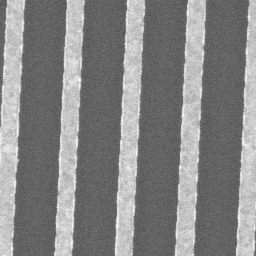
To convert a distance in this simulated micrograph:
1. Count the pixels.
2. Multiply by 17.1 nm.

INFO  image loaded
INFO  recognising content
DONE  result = lines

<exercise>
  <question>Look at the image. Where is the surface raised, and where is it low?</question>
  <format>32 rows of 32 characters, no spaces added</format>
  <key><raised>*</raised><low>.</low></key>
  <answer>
.**.....**......**.....***.....*
.**.....**......**.....***.....*
.**.....**......**.....**......*
.**.....**......**.....**......*
.**.....**......**.....**......*
.**.....**......**.....**......*
.**.....**......**.....**......*
.**.....**......**.....**......*
.**.....**......**.....**......*
***.....**.....**......**......*
**......**.....**......**......*
**......**.....**......**......*
**......**.....**......**......*
**......**.....**......**......*
**......**.....**......**.....**
**......**.....**......**.....**
**......**.....**......**.....**
**......**.....**......**.....**
**......**.....**......**.....**
**.....**......**......**.....**
**.....**......**......**.....**
**.....**......**.....***.....**
**.....**......**.....***.....**
**.....**......**.....**......**
**.....**......**.....**......**
**.....**......**.....**......**
**.....**......**.....**......**
**.....**......**.....**......**
**.....**......**.....**......**
**.....**......**.....**......**
*......**.....**......**......**
*......**.....**......**......**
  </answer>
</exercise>